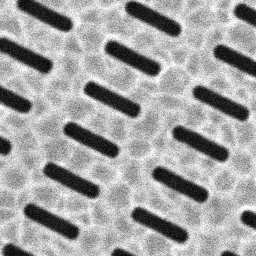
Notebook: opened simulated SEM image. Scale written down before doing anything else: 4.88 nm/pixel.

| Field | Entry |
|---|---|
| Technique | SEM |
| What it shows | a regular array of holes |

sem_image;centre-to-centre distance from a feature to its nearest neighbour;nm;222